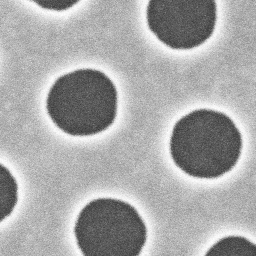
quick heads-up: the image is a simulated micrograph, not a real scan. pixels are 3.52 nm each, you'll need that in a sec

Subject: holes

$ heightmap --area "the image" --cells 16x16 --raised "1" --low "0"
1110111110000011
1111111110000111
1111111111000111
1111111111111111
1111001111111111
1110000111111111
1110000111111111
1110000111100011
1111111111100001
1111111111100001
1111111111100001
0111111111111111
0111110011111111
0111100001111111
1111100001111111
1111100001111000